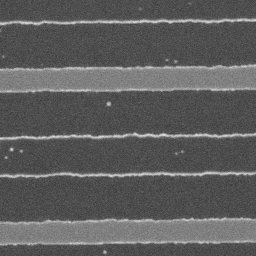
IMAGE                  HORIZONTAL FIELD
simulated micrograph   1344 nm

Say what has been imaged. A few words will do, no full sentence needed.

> lines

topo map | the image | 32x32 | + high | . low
++++++++++++++++++++++++++++++++
++++++++++++++++++++++++++++++++
++++++++++++++++++++++++++++++++
................................
................................
................................
................................
................................
........++++++++++++++++++++++++
++++++++++++++++++++++++++++++++
++++++++++++++++++++++++++++++++
................................
................................
................................
................................
................................
................................
++++++++++++++++++++++++++++++++
++++++++++++++++++++++++++++++++
++++++++++++++++++++++++++++++++
++++++++++++++++++++++++++++++++
++++++++++++++++++++++++++++++++
................................
................................
................................
................................
................................
.............+++..+..+++++++++++
++++++++++++++++++++++++++++++++
++++++++++++++++++++++++++++++++
++.+............................
................................